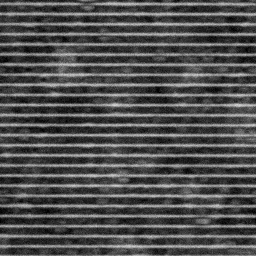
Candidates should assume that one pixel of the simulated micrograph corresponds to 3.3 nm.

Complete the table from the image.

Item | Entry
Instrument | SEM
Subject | parallel lines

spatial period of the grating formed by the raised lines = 33.3 nm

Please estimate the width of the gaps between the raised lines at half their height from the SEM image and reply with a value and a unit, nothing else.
28.1 nm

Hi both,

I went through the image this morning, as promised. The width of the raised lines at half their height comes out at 1.24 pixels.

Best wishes